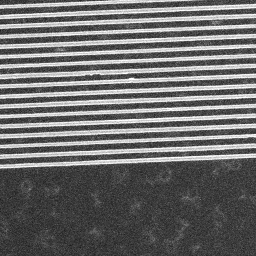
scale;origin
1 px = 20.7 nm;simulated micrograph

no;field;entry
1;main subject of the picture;parallel lines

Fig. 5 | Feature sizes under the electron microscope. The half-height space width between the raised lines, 140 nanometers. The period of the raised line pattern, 206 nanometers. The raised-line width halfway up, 0.0749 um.